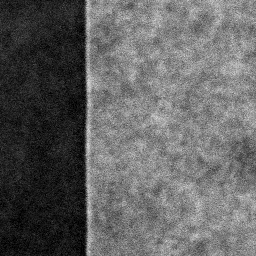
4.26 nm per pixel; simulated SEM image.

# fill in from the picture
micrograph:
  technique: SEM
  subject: one or a few lines or trenches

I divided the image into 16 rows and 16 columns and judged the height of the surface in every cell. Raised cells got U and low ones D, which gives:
DDDDDUUUUUUUUUUU
DDDDDUUUUUUUUUUU
DDDDDUUUUUUUUUUU
DDDDDUUUUUUUUUUU
DDDDDUUUUUUUUUUU
DDDDDUUUUUUUUUUU
DDDDDDUUUUUUUUUU
DDDDDDUUUUUUUUUU
DDDDDDUUUUUUUUUU
DDDDDUUUUUUUUUUU
DDDDDUUUUUUUUUUU
DDDDDDUUUUUUUUUU
DDDDDDUUUUUUUUUU
DDDDDDUUUUUUUUUU
DDDDDDUUUUUUUUUU
DDDDDDUUUUUUUUUU